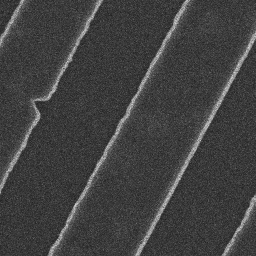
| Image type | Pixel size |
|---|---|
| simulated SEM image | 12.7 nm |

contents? one or a few lines or trenches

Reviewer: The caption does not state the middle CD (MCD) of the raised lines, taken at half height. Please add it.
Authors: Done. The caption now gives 981 nm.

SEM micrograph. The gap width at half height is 968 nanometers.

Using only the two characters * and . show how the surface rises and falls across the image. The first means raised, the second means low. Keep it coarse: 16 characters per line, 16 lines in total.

.*****.....*****
.*****.....*****
*****.....******
****......*****.
****.....******.
***......*****..
**......******..
**......*****...
**.....******...
*......*****....
*.....******....
......*****.....
.....*****......
....******.....*
....*****......*
...******.....**